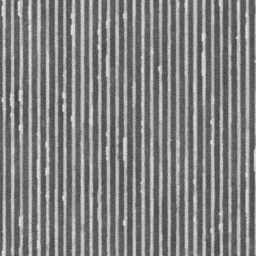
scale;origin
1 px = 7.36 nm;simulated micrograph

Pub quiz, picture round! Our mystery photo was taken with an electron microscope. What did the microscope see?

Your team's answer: parallel lines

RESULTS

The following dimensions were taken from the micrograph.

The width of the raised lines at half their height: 21.2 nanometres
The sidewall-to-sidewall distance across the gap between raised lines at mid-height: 5.75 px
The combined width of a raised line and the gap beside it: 63.7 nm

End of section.